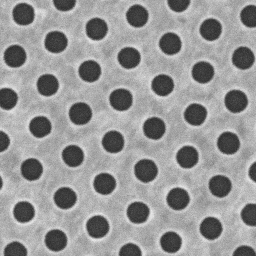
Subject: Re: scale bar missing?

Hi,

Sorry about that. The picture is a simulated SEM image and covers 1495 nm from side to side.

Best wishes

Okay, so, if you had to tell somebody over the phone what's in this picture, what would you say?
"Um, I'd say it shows a regular array of holes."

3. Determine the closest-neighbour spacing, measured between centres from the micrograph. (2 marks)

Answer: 248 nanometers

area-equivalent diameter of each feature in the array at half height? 141 nanometres